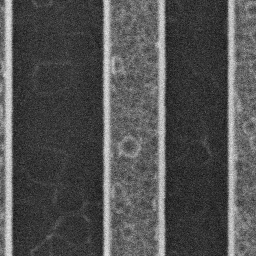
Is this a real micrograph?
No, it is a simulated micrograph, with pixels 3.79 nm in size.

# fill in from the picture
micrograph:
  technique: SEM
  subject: one or a few lines or trenches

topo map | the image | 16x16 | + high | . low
+......+++....++
+......+++....++
+......+++....++
+......+++....++
+......+++....++
+......+++....++
+......+++....++
+......+++....++
+......+++....++
+......+++....++
+......+++....++
+......+++....++
+......+++....++
+......+++....++
+......+++....++
+......+++....++